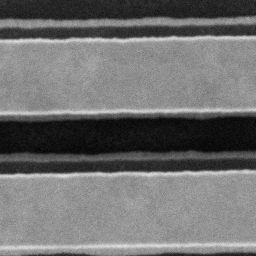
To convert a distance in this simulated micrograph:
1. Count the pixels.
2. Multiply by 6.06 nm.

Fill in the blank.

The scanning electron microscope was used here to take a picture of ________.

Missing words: lines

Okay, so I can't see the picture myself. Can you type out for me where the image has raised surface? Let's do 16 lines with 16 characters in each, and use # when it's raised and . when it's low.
................
.........#.###.#
################
################
################
################
################
................
................
................
########.#######
################
################
################
################
#####...........